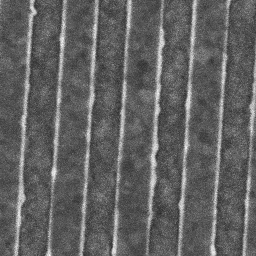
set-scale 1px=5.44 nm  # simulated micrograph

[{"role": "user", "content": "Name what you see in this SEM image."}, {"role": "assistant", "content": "one or a few lines or trenches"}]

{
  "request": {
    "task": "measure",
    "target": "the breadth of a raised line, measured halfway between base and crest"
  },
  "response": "0.194 micrometres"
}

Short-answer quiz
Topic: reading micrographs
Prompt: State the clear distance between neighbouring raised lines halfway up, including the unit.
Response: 159 nm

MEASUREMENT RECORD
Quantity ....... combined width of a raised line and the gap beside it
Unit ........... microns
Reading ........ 0.354